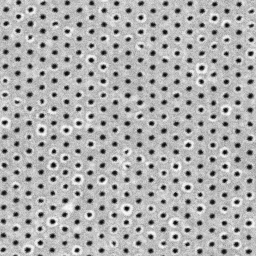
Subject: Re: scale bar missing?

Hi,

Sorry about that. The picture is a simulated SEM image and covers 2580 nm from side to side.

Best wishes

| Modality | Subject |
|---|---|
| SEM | a regular array of holes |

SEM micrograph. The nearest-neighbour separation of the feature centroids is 0.14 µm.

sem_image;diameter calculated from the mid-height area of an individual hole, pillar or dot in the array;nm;61.3